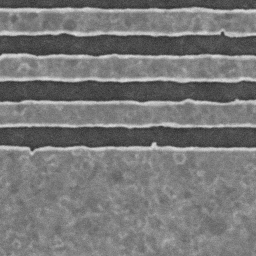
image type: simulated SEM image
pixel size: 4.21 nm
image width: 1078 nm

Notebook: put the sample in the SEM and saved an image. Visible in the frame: parallel lines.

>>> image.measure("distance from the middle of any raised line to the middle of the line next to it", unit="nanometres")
194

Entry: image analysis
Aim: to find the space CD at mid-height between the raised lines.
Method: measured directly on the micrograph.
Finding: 93.6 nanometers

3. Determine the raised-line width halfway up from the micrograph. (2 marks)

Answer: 102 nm